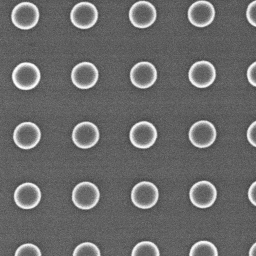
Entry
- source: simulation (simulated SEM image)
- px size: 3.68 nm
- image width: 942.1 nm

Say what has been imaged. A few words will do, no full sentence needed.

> a regular array of raised bodies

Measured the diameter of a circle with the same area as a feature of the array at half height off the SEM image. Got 26.3 px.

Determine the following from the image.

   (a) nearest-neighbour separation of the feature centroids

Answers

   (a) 215 nm